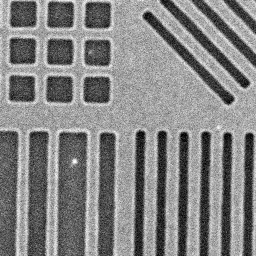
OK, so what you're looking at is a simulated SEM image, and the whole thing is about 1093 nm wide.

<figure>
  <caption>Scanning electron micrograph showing groups of lines, slits or small figures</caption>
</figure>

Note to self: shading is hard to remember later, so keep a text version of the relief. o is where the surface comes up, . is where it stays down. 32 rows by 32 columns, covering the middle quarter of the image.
..oooo......ooooooooooooooooooo.
oooooooooooooooooooooooooooooooo
oooooooooooooooooooooooooooooooo
..ooo.......oooooooooooooooooooo
..ooo.......oooooooooooooooooooo
..ooo.......oooooooooooooooooooo
..ooo.......oooooooooooooooooooo
..ooo.......oooooooooooooooooooo
..ooo.......oooooooooooooooooooo
..ooo......ooooooooooooooooooooo
oooooooooooooooooooooooooooooooo
oooooooooooooooooooooooooooooooo
oooooooooooooooooooooooooooooooo
oooooooooooooooooooooooooooooooo
oooooooooooooooooooooooooooooooo
oooooooooooooooooooooooooooooooo
ooooooooooooooooooo.oooo.ooooooo
......ooo....ooooo..ooo...ooo..o
......oo.....ooooo...oo...ooo..o
......oo.....ooooo..ooo...ooo..o
......oo.....ooooo..ooo...ooo..o
......oo.....ooooo..ooo...oo...o
......oo.....ooooo..ooo...oo...o
......oo.....ooooo..ooo...oo...o
......oo.....ooooo..ooo...oo...o
......oo.....ooooo..ooo...oo...o
......oo.....ooooo..ooo...oo...o
......oo.....ooooo..ooo...oo...o
......oo.....oooo...ooo...oo...o
......oo.....oooo...ooo...oo...o
......oo.....oooo...ooo...oo...o
......oo.....oooo...ooo...oo...o